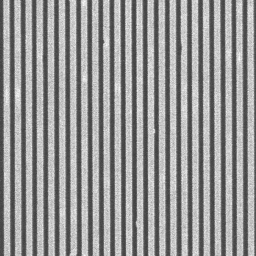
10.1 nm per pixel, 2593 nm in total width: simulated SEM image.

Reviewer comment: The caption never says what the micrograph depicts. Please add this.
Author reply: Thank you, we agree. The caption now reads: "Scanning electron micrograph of parallel lines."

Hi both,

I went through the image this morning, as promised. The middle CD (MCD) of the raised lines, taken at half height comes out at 6.51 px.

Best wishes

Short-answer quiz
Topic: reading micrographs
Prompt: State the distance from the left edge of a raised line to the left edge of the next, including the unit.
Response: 112 nm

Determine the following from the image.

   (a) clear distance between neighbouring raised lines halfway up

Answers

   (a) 0.0469 micrometres